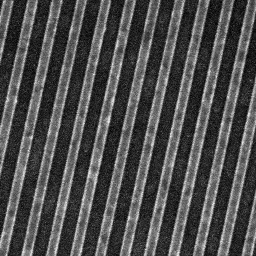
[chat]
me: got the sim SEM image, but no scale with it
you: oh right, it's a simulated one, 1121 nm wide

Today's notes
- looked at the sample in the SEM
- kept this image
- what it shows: parallel lines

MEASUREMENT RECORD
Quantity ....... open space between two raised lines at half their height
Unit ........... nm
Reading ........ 65.8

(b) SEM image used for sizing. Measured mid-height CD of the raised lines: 39.1 nanometres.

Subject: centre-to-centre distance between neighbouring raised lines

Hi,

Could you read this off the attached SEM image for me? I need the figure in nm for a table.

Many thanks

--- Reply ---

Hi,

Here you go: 105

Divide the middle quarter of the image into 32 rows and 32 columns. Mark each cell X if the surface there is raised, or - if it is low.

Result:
XX----XX----XX----XX----XX----XX
XX----XX----XX----XX----XX----XX
X-----XX---XXX----XX----XX----XX
X----XX----XX-----XX----XX----XX
X----XX----XX----XX----XXX---XXX
X----XX----XX----XX----XX----XX-
X----XX----XX----XX----XX----XX-
-----X----XXX----XX----XX----XX-
----XX----XX----XXX---XXX----XX-
----XX----XX----XX----XX----XXX-
----XX----XX----XX----XX----XX--
----XX----XX----XX----XX----XX--
---XX----XXX----XX----XX----XX--
---XX----XX-----X----XXX----XX--
---XX----XX----XX----XX----XXX--
---XX----XX----XX----XX----XX---
---XX---XXX----XX----XX----XX---
--XX----XX----XXX----XX----XX---
--XX----XX----XX----XXX---XXX---
--XX----XX----XX----XX----XX----
--XX----XX----XX----XX----XX----
--X----XXX----XX----XX----XX----
-XX----XX----XXX---XXX----XX----
-XX----XX----XX----XX----XXX----
-XX----XX----XX----XX----XX----X
-XX----XX----XX----XX----XX----X
XX----XXX---XXX----XX----XX----X
XX----XX----XX----XXX----XX----X
XX----XX----XX----XX----XXX---XX
XX----XX----XX----XX----XX----XX
XX---XXX----XX----XX----XX----XX
X----XX----XXX----XX----XX----XX